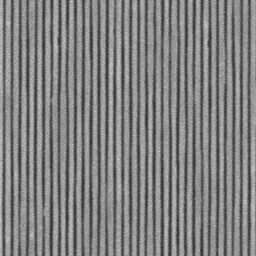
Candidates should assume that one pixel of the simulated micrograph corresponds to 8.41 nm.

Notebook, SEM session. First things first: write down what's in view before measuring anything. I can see parallel lines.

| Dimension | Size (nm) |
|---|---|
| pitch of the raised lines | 66.5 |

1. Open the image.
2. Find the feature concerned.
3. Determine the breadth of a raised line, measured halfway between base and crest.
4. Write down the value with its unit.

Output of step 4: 42.1 nm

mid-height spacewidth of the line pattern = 25.2 nanometers